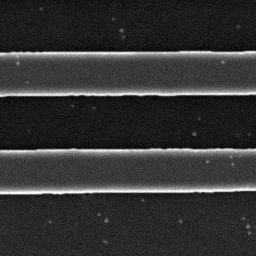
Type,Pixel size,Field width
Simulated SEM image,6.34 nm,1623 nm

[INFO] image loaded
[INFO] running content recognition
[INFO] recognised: lines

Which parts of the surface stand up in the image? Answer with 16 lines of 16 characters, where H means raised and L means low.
LLLLLLLLLLLLLLLL
LLLLLLLLLLLLLLLL
LLLLLLLLLLLLLLLL
HHHHHHHHHHHHHHHH
HHHHHHHHHHHHHHHH
HHHHHHHHHHHHHHHH
LLLLLLLLLLLLLLLL
LLLLLLLLLLLLLLLL
LLLLLLLLLLLLLLLL
HHHHHHHHHHHHHHHH
HHHHHHHHHHHHHHHH
HHHHHHHHHHHHHHHH
LLLLLLLLLLLLLLLL
LLLLLLLLLLLLLLLL
LLLLLLLLLLLLLLLL
LLLLLLLLLLLLLLLL